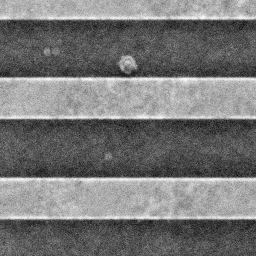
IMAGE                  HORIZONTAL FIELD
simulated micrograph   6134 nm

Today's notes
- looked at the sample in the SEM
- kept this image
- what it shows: lines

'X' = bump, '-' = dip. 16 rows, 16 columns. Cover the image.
XXXXXXXXXXXXXXXX
----------------
----------------
----------------
----------------
XXXXXXXXXXXXXXXX
XXXXXXXXXXXXXXXX
----------------
----------------
----------------
----------------
XXXXXXXXXXXXXXXX
XXXXXXXXXXXXXXXX
XXXXXXXXXXXXXXXX
----------------
----------------